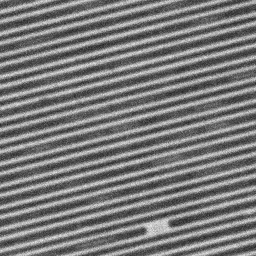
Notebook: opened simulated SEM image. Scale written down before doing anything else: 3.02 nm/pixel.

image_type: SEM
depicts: parallel lines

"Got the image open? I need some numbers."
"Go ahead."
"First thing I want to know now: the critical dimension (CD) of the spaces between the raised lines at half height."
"19.8 nm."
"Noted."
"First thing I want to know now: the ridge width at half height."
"0.0084 microns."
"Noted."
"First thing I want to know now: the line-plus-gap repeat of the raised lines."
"31.8 nanometers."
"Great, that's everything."